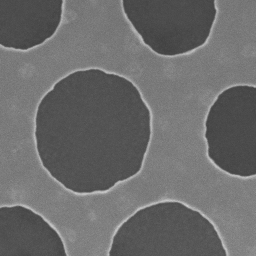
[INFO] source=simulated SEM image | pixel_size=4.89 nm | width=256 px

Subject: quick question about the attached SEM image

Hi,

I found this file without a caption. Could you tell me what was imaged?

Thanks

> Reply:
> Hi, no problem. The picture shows holes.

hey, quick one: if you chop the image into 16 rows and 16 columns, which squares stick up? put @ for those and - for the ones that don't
----@@@@-----@@@
----@@@@-----@@@
---@@@@@@----@@@
@@@@@@@@@@@@@@@@
@@@@@--@@@@@@@@@
@@@-----@@@@@@--
@@-------@@@@---
@@-------@@@@---
@@-------@@@@---
@@-------@@@@---
@@@------@@@@@--
@@@@---@@@@@@@@@
@@@@@@@@@@@@@@@@
--@@@@@@-----@@@
---@@@@-------@@
----@@@-------@@